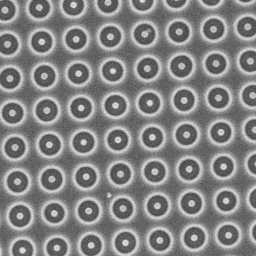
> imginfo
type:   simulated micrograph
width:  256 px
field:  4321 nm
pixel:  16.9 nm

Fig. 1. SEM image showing an array of small figures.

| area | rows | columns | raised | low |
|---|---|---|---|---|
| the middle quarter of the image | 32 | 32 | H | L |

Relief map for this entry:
HHLLLLHHHLLLLLLHHHLLLLLLHHLLLHLL
HLLLLLHHHLLLLLLHHHLLLLLLHHHLLLLL
HLLHLLLHHLLLLLLHHHLLLLLHHHHLLLLL
HLLLLLHHHHLLLLLHHHHLLLHHHHHHLLHH
HHLLLLHHHHHLLHHHHHHHHHHHHHHHHHHH
HHHHHHHHHHHHHHHHHHHHHHHHHHHHHHHH
HHHHHHHHHHHHHHHHHHHHHHHHHHHHHLLH
HHHHHHHHHHHHLHHHHHHLLLLHHHHHLLLL
HHHLLLHHHHHLLLLHHHHLLLLLHHHLLLLL
HHLLLLLHHHLLLLLLHHLLLLLLHHHLLLLL
HLLLLLLHHHLLHLLLHHHLLLLLHHHLLLLL
HLLLLLLHHHLLLLLLHHHLLLLLHHHHLLLL
HHLLLLLHHHHLLLLHHHHHLLHHHHHHHHHH
HHHLLLHHHHHHHHHHHHHHHHHHHHHHHHHH
HHHHHHHHHHHHHHHHHHHHHHHHHHHHHHHH
HHHHHHHHHHHHHHHHHHHHHLHHHHHHHLLL
HHHHHHHHHHHHLLLHHHHHLLLLHHHHLLLL
HHHLLLLHHHHLLLLLHHHHLLLLLHHHLLHL
HHLLLLLLHHHLLHLLHHHLLLHLLHHHLLLL
HHLLLLLLHHHLLLLLHHHLLLLLLHHHLLLL
HHLLLLLLHHHLLLLLHHHHLLLLHHHHHHLH
HHHLLLLHHHHHLLLHHHHHHHHHHHHHHHHH
HHHHLHHHHHHHHHHHHHHHHHHHHHHHHHHH
HHHHHHHHHHHHHHHHHHHHHHHHHHHHHHHH
HHHHHHHHHHHHHHHHHHHHHLLLHHHHHLLL
HHHHHLLHHHHHLLLLHHHHLLLLLHHHHLLL
HHHLLLLLHHHLLLLLLHHHLLHLLLHHLLLH
HHHLLLLLHHHLLLHLLHHHLLLLLHHHHLLL
HHHLLHLLHHHLLLLLLHHHLLLLLHHHHLLL
HHHLLLLLHHHHLLLLHHHHHLLLHHHHHHHH
HHHLLLLHHHHHHHHHHHHHHHHHHHHHHHHH
HHHHHHHHHHHHHHHHHHHHHHHHHHHHHHHH